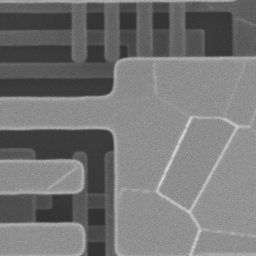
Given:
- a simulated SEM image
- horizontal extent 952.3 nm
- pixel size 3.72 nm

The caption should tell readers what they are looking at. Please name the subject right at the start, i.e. wiring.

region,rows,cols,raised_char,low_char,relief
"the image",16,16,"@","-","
----------------
----------------
----------------
----------------
-------@@@@@@@@@
-------@@@@@@@@@
@@@@@@@@@@@@@@@@
@@@@@@@@@@@@@@@@
-------@@@@@@@@@
-------@@@@@@@@@
@@@@@--@@@@@@@@@
@@@@@--@@@@@@@@@
-------@@@@@@@@@
-------@@@@@@@@@
@@@@@--@@@@@@@@@
@@@@@--@@@@@@@@@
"